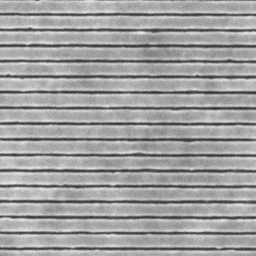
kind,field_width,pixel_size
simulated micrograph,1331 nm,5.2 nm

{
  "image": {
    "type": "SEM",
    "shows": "parallel lines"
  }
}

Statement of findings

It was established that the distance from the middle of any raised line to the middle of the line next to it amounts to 81.2 nanometres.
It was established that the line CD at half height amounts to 0.0637 µm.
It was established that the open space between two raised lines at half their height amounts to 0.0182 microns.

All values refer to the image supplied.